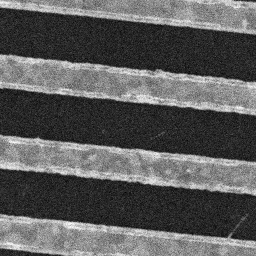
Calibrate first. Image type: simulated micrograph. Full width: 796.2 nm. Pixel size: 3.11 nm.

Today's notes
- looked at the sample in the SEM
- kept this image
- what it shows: one or a few lines or trenches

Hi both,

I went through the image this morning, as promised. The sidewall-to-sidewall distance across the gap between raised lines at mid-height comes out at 153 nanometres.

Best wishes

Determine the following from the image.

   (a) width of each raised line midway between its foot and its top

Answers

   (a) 96.3 nanometers